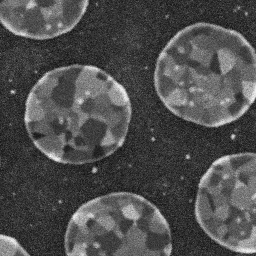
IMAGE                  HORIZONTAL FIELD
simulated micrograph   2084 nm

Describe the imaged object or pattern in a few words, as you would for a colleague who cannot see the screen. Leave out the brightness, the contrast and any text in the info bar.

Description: raised bodies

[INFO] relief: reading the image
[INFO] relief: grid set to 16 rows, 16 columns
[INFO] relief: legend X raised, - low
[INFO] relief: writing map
XXXXX-----------
XXXXX-----------
-----------XXXX-
----------XXXXXX
---XXX----XXXXXX
--XXXXXX--XXXXXX
--XXXXXX--XXXXXX
--XXXXXX----XX--
--XXXXXX--------
---XXXX---------
-------------XXX
-------------XXX
------XXX---XXXX
-----XXXXX--XXXX
----XXXXXXX--XXX
X---XXXXXXX----X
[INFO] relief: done